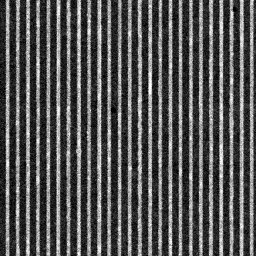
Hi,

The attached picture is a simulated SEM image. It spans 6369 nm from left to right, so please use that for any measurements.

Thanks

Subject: parallel lines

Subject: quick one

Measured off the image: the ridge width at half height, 71.5 nanometres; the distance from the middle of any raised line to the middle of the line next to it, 253 nanometers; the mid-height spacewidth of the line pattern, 7.13 pixels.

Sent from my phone